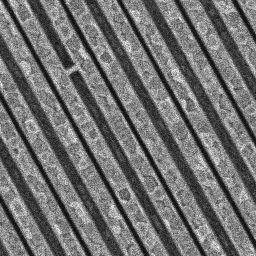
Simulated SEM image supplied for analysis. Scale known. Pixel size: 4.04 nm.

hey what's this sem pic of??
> parallel lines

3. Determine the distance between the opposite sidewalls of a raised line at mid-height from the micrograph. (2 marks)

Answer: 69.2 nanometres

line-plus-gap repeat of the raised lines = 101 nm